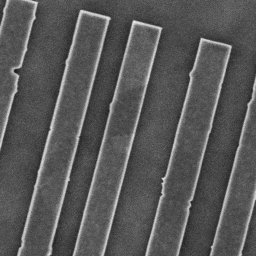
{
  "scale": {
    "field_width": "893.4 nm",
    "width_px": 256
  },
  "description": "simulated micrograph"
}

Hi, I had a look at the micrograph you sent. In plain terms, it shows one or a few lines or trenches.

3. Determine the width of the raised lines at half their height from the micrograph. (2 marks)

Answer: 101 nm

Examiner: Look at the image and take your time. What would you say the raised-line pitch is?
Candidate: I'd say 217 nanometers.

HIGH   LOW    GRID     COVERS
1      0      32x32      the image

01110000000000000000000000000000
01110000000000000000000000000000
11110000001110000000000000000000
11110000001110001111000000000000
11110000011110001111000000000000
11100000011110001111000001110000
11100000011110001110000001111000
11100000111100001110000001110000
11000000111100011110000011110000
11000000111100011110000011110000
11000000111100011100000011110000
11000000111000111100000011100000
10000001111000111100000111100001
10000001111000111100000111100001
10000001110000111000000111100001
10000001110001111000001111000001
00000011110001111000001111000011
00000011110001111000001111000011
00000011100001110000001111000011
00000011100011110000011110000011
00000111100011110000011110000111
00000111100011110000011110000111
00000111000011100000011110000111
00001111000111100000111100000111
00001111000111100000111100001111
00001111000111000000111100001111
00001110000111000000111100001110
00011110001111000001111000001110
00011110001111000001111000011110
00011110001110000001111000011110
00011100001110000001111000011100
00111100011110000011110000111100